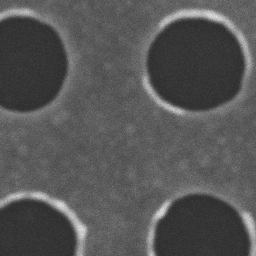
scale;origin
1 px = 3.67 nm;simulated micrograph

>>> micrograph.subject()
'holes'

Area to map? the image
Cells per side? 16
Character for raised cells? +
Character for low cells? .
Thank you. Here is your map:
++++++++++++++++
...++++++++...++
....++++++.....+
....+++++......+
....+++++......+
....++++++.....+
...++++++++...++
++++++++++++++++
++++++++++++++++
++++++++++++++++
++++++++++++++++
++++++++++++++++
+..++++++++...++
....++++++.....+
.....+++++.....+
.....+++++......